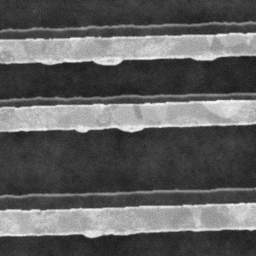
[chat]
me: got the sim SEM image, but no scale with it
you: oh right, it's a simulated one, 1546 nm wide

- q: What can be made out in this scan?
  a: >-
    lines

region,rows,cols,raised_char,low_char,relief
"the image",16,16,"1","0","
0000000000000000
0000000000000111
1111111111111111
1111111111111110
0000000000000000
0000000000000000
1111111111111111
1111111111111111
0000000000000000
0000000000000000
0000000000000000
0000000000000000
1111111111111111
1111111111111111
1111111110000000
0000000000000000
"